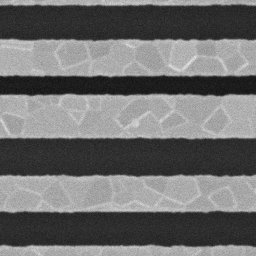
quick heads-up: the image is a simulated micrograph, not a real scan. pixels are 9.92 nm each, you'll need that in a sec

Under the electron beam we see lines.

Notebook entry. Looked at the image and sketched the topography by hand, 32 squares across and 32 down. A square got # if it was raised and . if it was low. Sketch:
##################.##########.##
................................
................................
................................
................................
################################
################################
################################
################################
...........#.#..................
................................
................................
################################
################################
################################
################################
################################
................................
................................
................................
................................
................................
################################
################################
################################
################################
.#.....###...........#..........
................................
................................
................................
................................
################################